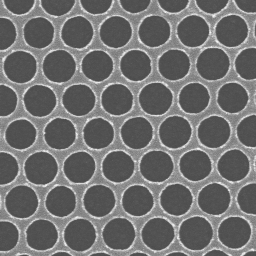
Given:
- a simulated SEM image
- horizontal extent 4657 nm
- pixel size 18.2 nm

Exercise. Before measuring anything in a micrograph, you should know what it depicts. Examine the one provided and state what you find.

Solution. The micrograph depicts a regular array of holes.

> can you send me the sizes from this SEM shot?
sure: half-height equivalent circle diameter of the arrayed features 585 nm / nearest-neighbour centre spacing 0.696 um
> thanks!